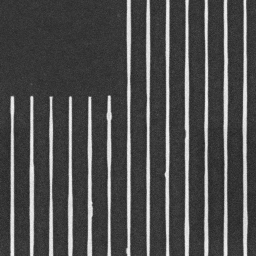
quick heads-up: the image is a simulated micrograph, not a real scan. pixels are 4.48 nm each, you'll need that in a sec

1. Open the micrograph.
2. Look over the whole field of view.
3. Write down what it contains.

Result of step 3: parallel lines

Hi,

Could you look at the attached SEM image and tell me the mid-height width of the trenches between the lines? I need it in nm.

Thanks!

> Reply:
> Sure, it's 72.2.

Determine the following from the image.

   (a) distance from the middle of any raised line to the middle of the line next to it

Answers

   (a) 86.9 nanometres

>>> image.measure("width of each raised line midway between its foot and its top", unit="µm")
0.0129